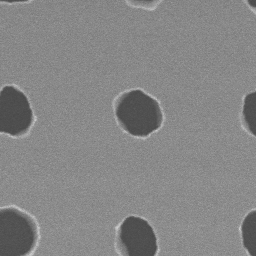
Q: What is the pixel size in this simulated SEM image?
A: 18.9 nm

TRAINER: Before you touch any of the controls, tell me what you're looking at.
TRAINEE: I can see holes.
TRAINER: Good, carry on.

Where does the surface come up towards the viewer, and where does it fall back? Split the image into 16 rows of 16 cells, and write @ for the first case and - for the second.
@@@@@@@@@@@@@@@@
@@@@@@@@@@@@@@@@
@@@@@@@@@@@@@@@@
@@@@@@@@@@@@@@@@
@@@@@@@@@@@@@@@@
-@@@@@@@@@@@@@@@
--@@@@@---@@@@@-
--@@@@@---@@@@@-
@@@@@@@@@@@@@@@@
@@@@@@@@@@@@@@@@
@@@@@@@@@@@@@@@@
@@@@@@@@@@@@@@@@
@@@@@@@@@@@@@@@@
--@@@@@@@@@@@@@-
--@@@@@@--@@@@@-
--@@@@@@--@@@@@-